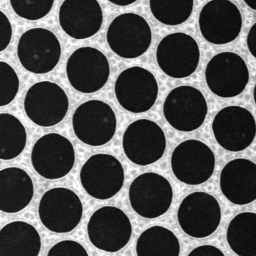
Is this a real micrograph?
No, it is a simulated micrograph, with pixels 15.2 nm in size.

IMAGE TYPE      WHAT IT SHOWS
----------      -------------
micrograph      a regular array of holes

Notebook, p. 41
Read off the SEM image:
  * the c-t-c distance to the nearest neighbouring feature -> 797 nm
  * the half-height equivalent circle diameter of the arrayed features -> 45.2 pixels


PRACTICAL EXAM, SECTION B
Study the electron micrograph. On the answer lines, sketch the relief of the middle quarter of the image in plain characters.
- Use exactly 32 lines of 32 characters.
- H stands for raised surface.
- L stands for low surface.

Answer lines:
HLLLLLLLLLLHHHHHHHHHHHHHLLLLLLLL
LLLLLLLLLLLHHHHLLLLLLHHHLLLLLLLL
HLLLLLLLLLLHHHLLLLLLLLHHHLLLLLLL
HLLLLLLLLLLHHLLLLLLLLLLHHHHLLHHH
HLLLLLLLLLLHHLLLLLLLLLLHHHHHHHHH
HHLLLLLLLLHHHLLLLLLLLLLLHHHHHLLL
HHHLLLLLLHHHHLLLLLLLLLLLHHHLLLLL
LHHHHHHHHHHHHLLLLLLLLLLHHHLLLLLL
LHHHHHHHHHHHHLLLLLLLLLLHHLLLLLLL
LHHHHLLLLLHHHHLLLLLLLLLHHLLLLLLL
LHHHLLLLLLLHHHLLLLLLLLHHHLLLLLLL
LHHLLLLLLLLLHHHHLLLLLHHHHLLLLLLL
LHLLLLLLLLLLLHHHHHHHHHHHHLLLLLLL
HHLLLLLLLLLLLHHHHHHHHHHHHLLLLLLL
HHLLLLLLLLLLLHHHHLLLLLLHHHLLLLLL
HHLLLLLLLLLLLHHHLLLLLLLLHHHLLLLL
HHLLLLLLLLLLLHHLLLLLLLLLLHHHLLLL
HHHLLLLLLLLLHHHLLLLLLLLLLHHHHHHH
LHHLLLLLLLLLHHHLLLLLLLLLLHHHHHHH
LLHHHLLLLLLHHHHLLLLLLLLLLLHHHLLL
LLHHHHHLLHHHHHHLLLLLLLLLLLHHLLLL
LLLHHHHHHHHHHHHLLLLLLLLLLHHLLLLL
LLLHHHHHLLLHHHHLLLLLLLLLLHHLLLLL
LLLHHHLLLLLLLHHHLLLLLLLLHHHLLLLL
LLLHHLLLLLLLLLHHHLLLLLLHHHHLLLLL
LLHHHLLLLLLLLLLHHHHLHHHHHHHLLLLL
LLHHLLLLLLLLLLLHHHHHHHHHHHHLLLLL
LHHHLLLLLLLLLLLHHHHLLLLLHHHLLLLL
HHHHLLLLLLLLLLLHHHLLLLLLLHHHLLLL
HHHHLLLLLLLLLLLHHLLLLLLLLLHHHLLL
HHHHHLLLLLLLLLLHLLLLLLLLLLLHHHHH
LLHHHLLLLLLLLLHHLLLLLLLLLLLHHHHH